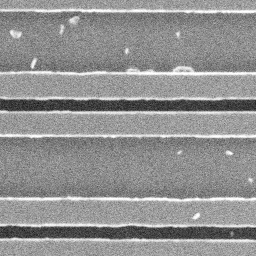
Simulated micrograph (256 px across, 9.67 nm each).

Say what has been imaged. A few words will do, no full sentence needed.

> lines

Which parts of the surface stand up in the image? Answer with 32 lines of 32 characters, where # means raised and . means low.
################################
................................
................................
................................
................................
................................
................................
................................
................................
################################
################################
################################
................................
................................
################################
################################
################################
................................
................................
................................
................................
................................
................................
................................
................................
################################
################################
################################
................................
................................
################################
################################